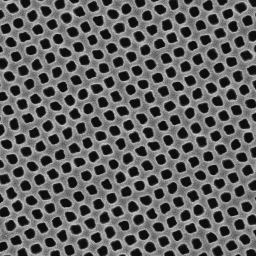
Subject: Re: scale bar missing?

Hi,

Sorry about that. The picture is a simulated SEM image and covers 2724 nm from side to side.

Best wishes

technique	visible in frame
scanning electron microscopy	a regular array of holes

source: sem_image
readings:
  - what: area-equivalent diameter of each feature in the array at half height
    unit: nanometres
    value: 105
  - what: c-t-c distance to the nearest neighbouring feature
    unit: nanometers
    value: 153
